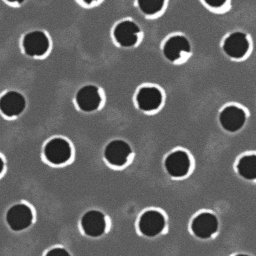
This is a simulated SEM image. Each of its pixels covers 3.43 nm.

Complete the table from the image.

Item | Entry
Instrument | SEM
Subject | a regular array of holes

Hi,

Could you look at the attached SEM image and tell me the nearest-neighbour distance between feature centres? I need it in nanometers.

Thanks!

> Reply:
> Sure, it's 205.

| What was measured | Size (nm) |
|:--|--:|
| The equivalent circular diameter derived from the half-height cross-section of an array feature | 89.1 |